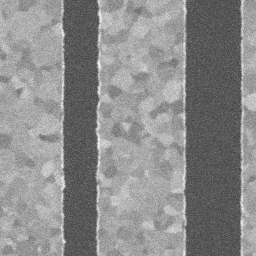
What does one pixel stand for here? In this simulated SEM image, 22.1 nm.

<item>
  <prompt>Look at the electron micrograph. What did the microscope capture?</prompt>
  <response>one or a few lines or trenches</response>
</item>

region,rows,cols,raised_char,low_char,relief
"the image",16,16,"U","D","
UUUUDDUUUUUUDDDU
UUUUDDUUUUUUDDDU
UUUUDDUUUUUUDDDU
UUUUDDUUUUUUDDDU
UUUUDDUUUUUUDDDU
UUUUDDUUUUUUDDDU
UUUUDDUUUUUDDDDU
UUUUDDUUUUUUDDDU
UUUUDDUUUUUUDDDU
UUUUDDUUUUUUDDDU
UUUUDDUUUUUUDDDU
UUUUDDUUUUUDDDDU
UUUUDDUUUUUUDDDU
UUUUDDUUUUUUDDDU
UUUUDDUUUUUUDDDU
UUUUDDUUUUUUDDDU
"